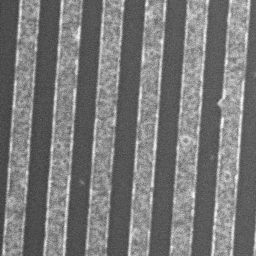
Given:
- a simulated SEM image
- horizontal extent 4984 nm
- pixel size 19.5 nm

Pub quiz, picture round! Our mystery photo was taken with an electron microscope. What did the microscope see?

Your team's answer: parallel lines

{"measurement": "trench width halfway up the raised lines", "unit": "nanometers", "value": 439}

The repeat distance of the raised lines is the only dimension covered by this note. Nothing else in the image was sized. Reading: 814 nm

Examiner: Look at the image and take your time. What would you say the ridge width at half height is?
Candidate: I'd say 0.374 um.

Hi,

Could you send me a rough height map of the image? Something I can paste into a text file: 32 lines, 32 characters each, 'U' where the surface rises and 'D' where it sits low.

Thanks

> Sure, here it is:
DDDUUDDDUUDDDUUDDDUUUDDDUUDDDUUD
DDUUUDDDUUDDDUUDDDUUUDDUUUDDDUUD
DDUUUDDDUUDDDUUDDDUUUDDUUUDDDUUD
DDUUUDDDUUDDDUUDDDUUDDDUUUDDDUUD
DDUUUDDUUUDDDUUDDDUUDDDUUUDDUUUD
DDUUUDDUUUDDDUUDDDUUDDDUUUDDUUUD
DDUUDDDUUUDDDUUDDDUUDDDUUUDDUUUD
DDUUDDDUUUDDDUUDDDUUDDDUUDDDUUUD
DDUUDDDUUUDDUUUDDDUUDDDUUDDDUUUD
DDUUDDDUUDDDUUUDDDUUDDDUUDDDUUUD
DDUUDDDUUUDDUUUDDDUUDDDUUDDDUUDD
DDUUDDDUUDDDUUUDDDUUDDDUUDDDUUDD
DDUUDDDUUDDDUUUDDUUUDDDUUDDDUUDD
DDUUDDDUUDDDUUDDDUUUDDDUUDDDUUDD
DDUUDDDUUDDDUUDDDUUUDDDUUDDDUUDD
DDUUDDDUUDDDUUDDDUUUDDUUUDDDUUDD
DUUUDDDUUDDDUUDDDUUDDDUUUDDDUUDD
DUUUDDDUUDDDUUDDDUUDDDUUUDDDUUDD
DUUUDDDUUDDDUUDDDUUDDDUUUDDUUUDD
DUUUDDUUUDDDUUDDDUUDDDUUUDDUUUDD
DUUDDDUUUDDDUUDDDUUDDDUUUDDUUUDD
DUUDDDUUUDDDUUDDDUUDDDUUDDDUUUDD
DUUDDDUUUDDUUUDDDUUDDDUUDDDUUUDD
DUUDDDUUUDDUUUDDDUUDDDUUDDDUUUDD
DUUDDDUUUDDUUUDDDUUDDDUUDDDUUDDD
DUUDDDUUDDDUUUDDDUUDDDUUDDDUUDDD
DUUDDDUUDDDUUUDDDUUDDDUUDDDUUDDD
DUUDDDUUDDDUUDDDUUUDDDUUDDDUUDDD
DUUDDDUUDDDUUDDDUUUDDDUUDDDUUDDD
DUUDDDUUDDDUUDDDUUUDDUUUDDDUUDDD
UUUDDDUUDDDUUDDDUUUDDUUUDDDUUDDD
UUUDDDUUDDDUUDDDUUDDDUUUDDDUUDDD